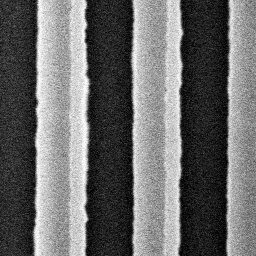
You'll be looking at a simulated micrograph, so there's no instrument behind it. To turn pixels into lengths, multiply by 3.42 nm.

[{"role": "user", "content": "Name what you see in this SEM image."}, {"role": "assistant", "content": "lines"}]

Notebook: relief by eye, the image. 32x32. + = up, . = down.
.....++++++......+++++.......+++
.....++++++......+++++.......+++
.....++++++......+++++.......+++
.....++++++......++++++......+++
.....++++++......++++++......+++
.....++++++......+++++.......+++
.....++++++......+++++.......+++
.....++++++......+++++.......+++
.....++++++......++++++......+++
.....++++++......+++++.......+++
.....++++++......++++++......+++
.....++++++......+++++.......+++
.....++++++......+++++.......+++
.....++++++......+++++.......+++
.....++++++......+++++.......+++
.....++++++......+++++.......+++
.....++++++......+++++.......+++
.....++++++......++++++......+++
.....++++++......++++++......+++
.....++++++......++++++......+++
.....++++++......+++++.......+++
.....++++++......++++++......+++
.....++++++......+++++.......+++
.....+++++.......+++++.......+++
.....++++++......+++++......++++
.....++++++......+++++.......+++
.....++++++......+++++......++++
.....++++++......+++++......++++
.....++++++......+++++......++++
....+++++++......+++++.......+++
.....++++++......+++++......++++
.....++++++......+++++......++++